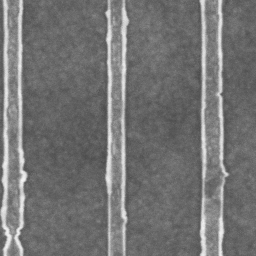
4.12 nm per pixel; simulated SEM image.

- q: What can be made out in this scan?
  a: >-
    one or a few lines or trenches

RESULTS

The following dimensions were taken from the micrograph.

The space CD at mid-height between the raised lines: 327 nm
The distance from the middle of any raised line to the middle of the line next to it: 410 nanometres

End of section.